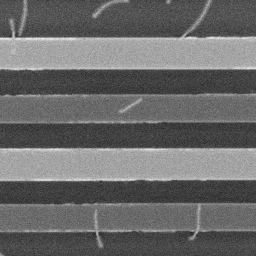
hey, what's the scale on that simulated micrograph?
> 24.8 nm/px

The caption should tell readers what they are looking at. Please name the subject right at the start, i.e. lines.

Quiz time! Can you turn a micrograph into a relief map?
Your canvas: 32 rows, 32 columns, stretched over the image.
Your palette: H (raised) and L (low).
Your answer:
LLLLLLLLLLLLLLLLLLLLLLLLLLLLLLLL
LLLLLLLLLLLLLLLLLLLLLLLLLLLLLLLL
LLLLLLLLLLLLLLLLLLLLLLLLLLLLLLLL
LLLLLLLLLLLLLLLLLLLLLLLLLLLLLLLL
LLLLLLLLLLLLLLLLLLLLLLLLLLLLLLLL
HHHHHHHHHHHHHHHHHHHHHHHHHHHHHHHH
HHHHHHHHHHHHHHHHHHHHHHHHHHHHHHHH
HHHHHHHHHHHHHHHHHHHHHHHHHHHHHHHH
HHHHHHHHHHHHHHHHHHHHHHHHHHHHHHHH
LLLLLLLLLLLLLLLLLLLLLLLLLLLLLLLL
LLLLLLLLLLLLLLLLLLLLLLLLLLLLLLLL
LLLLLLLLLLLLLLLLLLLLLLLLLLLLLLLL
HHHHHHHHHHHHHHHHHHHHHHHHHHHHHHHH
HHHHHHHHHHHHHHHHHHHHHHHHHHHHHHHH
HHHHHHHHHHHHHHHHHHHHHHHHHHHHHHHH
LLLLLLLLLLLLLLLLLLLLLLLLLLLLLLLL
LLLLLLLLLLLLLLLLLLLLLLLLLLLLLLLL
LLLLLLLLLLLLLLLLLLLLLLLLLLLLLLLL
LLLLLLLLLLLLLLLLLLLLLLLLLLLLLLLL
HHHHHHHHHHHHHHHHHHHHHHHHHHHHHHHH
HHHHHHHHHHHHHHHHHHHHHHHHHHHHHHHH
HHHHHHHHHHHHHHHHHHHHHHHHHHHHHHHH
HHHHHHHHHHHHLLLHLLLLLLLLLLLLLLLL
LLLLLLLLLLLLLLLLLLLLLLLLLLLLLLLL
LLLLLLLLLLLLLLLLLLLLLLLLLLLLLLLL
LLLLLLLLLLLLLLLLLLLLLLLLLLLLLLLL
HHHHHHHHHHHHHHHHHHHHHHHHHHHHHHHH
HHHHHHHHHHHHHHHHHHHHHHHHHHHHHHHH
HHHHHHHHHHHHHHHHHHHHHHHHHHHHHHHH
LLLLLLLLLLLLLLLLLLLLLLLLLLLLLLLL
LLLLLLLLLLLLLLLLLLLLLLLLLLLLLLLL
LLLLLLLLLLLLLLLLLLLLLLLLLLLLLLLL